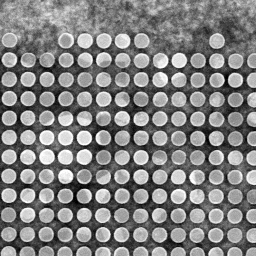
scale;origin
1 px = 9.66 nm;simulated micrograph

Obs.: a regular array of raised bodies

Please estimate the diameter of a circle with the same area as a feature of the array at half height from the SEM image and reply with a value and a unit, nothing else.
142 nm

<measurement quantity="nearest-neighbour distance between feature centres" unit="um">0.181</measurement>